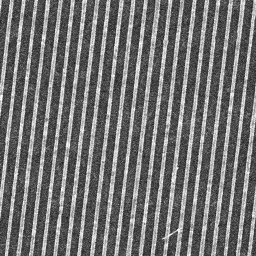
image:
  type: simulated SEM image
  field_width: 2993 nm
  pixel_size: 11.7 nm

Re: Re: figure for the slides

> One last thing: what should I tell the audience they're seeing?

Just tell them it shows parallel lines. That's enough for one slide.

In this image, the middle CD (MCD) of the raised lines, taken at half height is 34.8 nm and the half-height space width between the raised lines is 106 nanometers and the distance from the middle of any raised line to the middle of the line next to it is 141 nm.